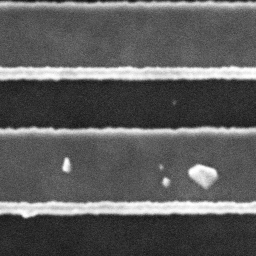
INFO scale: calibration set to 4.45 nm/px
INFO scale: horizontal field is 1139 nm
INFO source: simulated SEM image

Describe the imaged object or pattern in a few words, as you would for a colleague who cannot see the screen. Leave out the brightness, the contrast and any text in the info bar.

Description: lines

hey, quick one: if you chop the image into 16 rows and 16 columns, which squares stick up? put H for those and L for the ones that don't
HHHHHHHHHHHHHHHH
HHHHHHHHHHHHHHHH
HHHHHHHHHHHHHHHH
HHHHHHHHHHHHHHHH
HHHHHHHHHHHHHHHH
LLLLLLLLLLLLLLLL
LLLLLLLLLLLLLLLL
LLLLLLLLLLLLLLLL
HHHHHHHHHHHHHHHH
HHHHHHHHHHHHHHHH
HHHHHHHHHHHHHHHH
HHHHHHHHHHHHHHHH
HHHHHHHHHHHHHHHH
LLLLLLLLLLLLLLLL
LLLLLLLLLLLLLLLL
LLLLLLLLLLLLLLLL